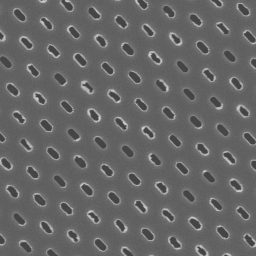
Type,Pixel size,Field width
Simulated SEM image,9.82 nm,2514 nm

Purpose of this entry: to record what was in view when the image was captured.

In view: a regular array of holes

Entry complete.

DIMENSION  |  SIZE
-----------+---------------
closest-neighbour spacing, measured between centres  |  0.272 um